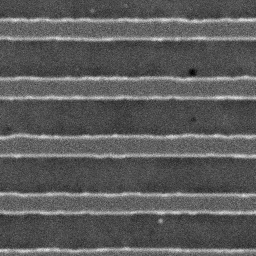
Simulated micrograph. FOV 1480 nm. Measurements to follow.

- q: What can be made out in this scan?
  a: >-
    lines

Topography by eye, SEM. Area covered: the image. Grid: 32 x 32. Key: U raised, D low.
DDDDDDDDDDDDDDDDDDDDDDDDDDDDDDDD
DDDDDDDDDDDDDDDDDDDDDDDDDDDDDDDD
UUUUUUDUUDUUDDUUUUUUUUUDDDDUUUUU
UUUUUUUUUUUUUUUUUUUUUUUUUUUUUUUU
UUUUUUUUUUUUUUUUUUUUUUUUUUUUUUUU
DDDDDDDDDDDDDDDDDDDDDDDDDDDDDDDD
DDDDDDDDDDDDDDDDDDDDDDDDDDDDDDDD
DDDDDDDDDDDDDDDDDDDDDDDDDDDDDDDD
DDDDDDDDDDDDDDDDDDDDDDDDDDDDDDDD
DDDDDDDDDDDDDDDDDDDDDDDDDDDDDDDD
UUUUUUUUUUUUUUUUUUUUUUUUUUUUUUUU
UUUUUUUUUUUUUUUUUUUUUUUUUUUUUUUU
DDDDDDDDDDDDDDDDDDDDDDDDDDDDDDDD
DDDDDDDDDDDDDDDDDDDDDDDDDDDDDDDD
DDDDDDDDDDDDDDDDDDDDDDDDDDDDDDDD
DDDDDDDDDDDDDDDDDDDDDDDDDDDDDDDD
DDDDDDDDDDDDDDDDDDDDDDDDDDDDDDDD
UUUUUUUUUUUUUUUUUUUUUUUUUUUUUUUU
UUUUUUUUUUUUUUUUUUUUUUUUUUUUUUUU
DUUDDDDDDDDDUDUUDDDDDDDDDDDDDUUU
DDDDDDDDDDDDDDDDDDDDDDDDDDDDDDDD
DDDDDDDDDDDDDDDDDDDDDDDDDDDDDDDD
DDDDDDDDDDDDDDDDDDDDDDDDDDDDDDDD
DDDDDDDDDDDDDDDDDDDDDDDDDDDDDDDD
UUUUUUUUUUUUUUUUUUUUUUUUUUUUUUUU
UUUUUUUUUUUUUUUUUUUUUUUUUUUUUUUU
UUUUUUUUUUUUUUUUUUUUUUUUUUUUUUUU
DDDDDDDDDDDDDDDDDDDDDDDDDDDDDDDD
DDDDDDDDDDDDDDDDDDDDDDDDDDDDDDDD
DDDDDDDDDDDDDDDDDDDDDDDDDDDDDDDD
DDDDDDDDDDDDDDDDDDDDDDDDDDDDDDDD
UUUUUUUUUUUUUUUUUUUUUUUUUUUUUUUU